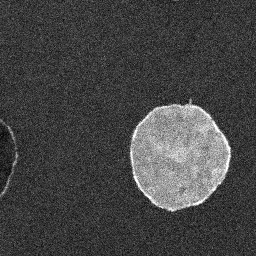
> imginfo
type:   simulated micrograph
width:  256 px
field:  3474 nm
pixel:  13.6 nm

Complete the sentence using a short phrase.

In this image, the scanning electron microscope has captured raised bodies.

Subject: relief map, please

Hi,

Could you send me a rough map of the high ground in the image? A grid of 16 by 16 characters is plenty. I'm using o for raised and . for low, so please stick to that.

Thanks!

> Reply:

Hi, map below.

................
................
................
................
................
................
................
.........oooo...
o.......oooooo..
o.......oooooo..
o.......oooooo..
.........ooooo..
.........oooo...
................
................
................